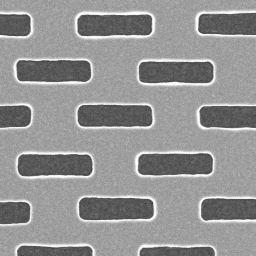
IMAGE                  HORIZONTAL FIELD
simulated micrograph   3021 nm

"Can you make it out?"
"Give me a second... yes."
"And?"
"holes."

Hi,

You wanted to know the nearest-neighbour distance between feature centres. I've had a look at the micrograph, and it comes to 888 nm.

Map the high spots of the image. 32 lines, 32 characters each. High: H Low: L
HHHHHHHHHHHHHHHHHHHHHHHHHHHHHHHH
HHHHHHHHHHHHHHHHHHHHHHHHHHHHHLLL
LLLLHHHHHHLLLLLLLLLHHHHHHLLLLLLL
LLLLHHHHHHLLLLLLLLLHHHHHHLLLLLLL
LLLHHHHHHHLLLLLLLLHHHHHHHHHHHHHH
HHHHHHHHHHHHHHHHHHHHHHHHHHHHHHHH
HHHHHHHHHHHHHHHHHHHHHHHHHHHHHHHH
HHHHHHHHHHHHHHHHHHHHHHHHHHHHHHHH
HHLLLLLLLLLHHHHHHLLLLLLLLLLHHHHH
HHLLLLLLLLLHHHHHHLLLLLLLLLLHHHHH
HHHHHHHHHHHHHHHHHHHHHHHHHHHHHHHH
HHHHHHHHHHHHHHHHHHHHHHHHHHHHHHHH
HHHHHHHHHHHHHHHHHHHHHHHHHHHHHHHH
LLLLHHHHHHLLLLLLLLLHHHHHHLLLLLLL
LLLLHHHHHHLLLLLLLLLHHHHHHLLLLLLL
LLLLHHHHHHLLLLLLLLLHHHHHHLLLLLLL
HHHHHHHHHHHHHHHHHHHHHHHHHHHHHHHH
HHHHHHHHHHHHHHHHHHHHHHHHHHHHHHHH
HHHHHHHHHHHHHHHHHHHHHHHHHHHHHHHH
HHHLLLLLLLLHHHHHHLLLLLLLLLHHHHHH
HHLLLLLLLLLLHHHHHLLLLLLLLLLHHHHH
HHLLLLLLLLLLHHHHHLLLLLLLLLHHHHHH
HHHHHHHHHHHHHHHHHHHHHHHHHHHHHHHH
HHHHHHHHHHHHHHHHHHHHHHHHHHHHHHHH
HHHHHHHHHHHHHHHHHHHHHHHHHHHHHHHH
LLLHHHHHHHLLLLLLLLLHHHHHHLLLLLLL
LLLLHHHHHHLLLLLLLLLHHHHHHLLLLLLL
LLLLHHHHHHHLLLLHHHHHHHHHHHLLLLLL
HHHHHHHHHHHHHHHHHHHHHHHHHHHHHHHH
HHHHHHHHHHHHHHHHHHHHHHHHHHHHHHHH
HHHHHHHHHHHHHHHHHHHHHHHHHHHHHHHH
HHLLLLLLLLLLHHHHHLLLLLLLLLLHHHHH